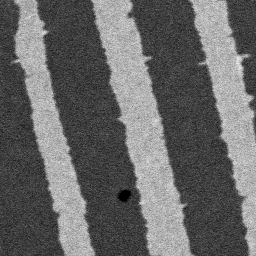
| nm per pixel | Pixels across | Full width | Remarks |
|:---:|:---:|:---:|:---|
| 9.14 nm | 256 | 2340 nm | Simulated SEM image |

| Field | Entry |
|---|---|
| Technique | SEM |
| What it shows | one or a few lines or trenches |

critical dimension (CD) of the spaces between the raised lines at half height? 543 nanometers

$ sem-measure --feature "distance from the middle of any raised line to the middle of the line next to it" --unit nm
832